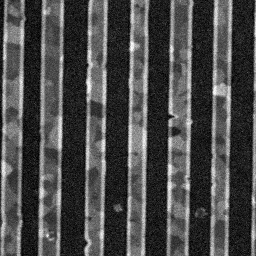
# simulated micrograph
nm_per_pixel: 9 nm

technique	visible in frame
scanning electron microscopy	parallel lines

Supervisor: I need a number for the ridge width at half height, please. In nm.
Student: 143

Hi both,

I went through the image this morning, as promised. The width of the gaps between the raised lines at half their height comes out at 26.6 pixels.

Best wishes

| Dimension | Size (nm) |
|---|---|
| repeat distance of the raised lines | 376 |